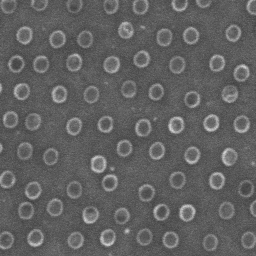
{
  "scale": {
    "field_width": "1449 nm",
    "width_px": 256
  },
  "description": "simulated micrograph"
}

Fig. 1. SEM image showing a regular array of raised bodies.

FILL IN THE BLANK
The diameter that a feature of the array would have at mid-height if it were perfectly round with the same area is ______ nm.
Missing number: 88.8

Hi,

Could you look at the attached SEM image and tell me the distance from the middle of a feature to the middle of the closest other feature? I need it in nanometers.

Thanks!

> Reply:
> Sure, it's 153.